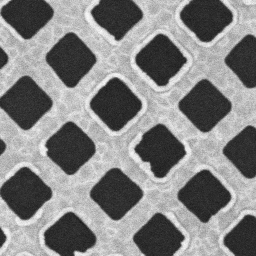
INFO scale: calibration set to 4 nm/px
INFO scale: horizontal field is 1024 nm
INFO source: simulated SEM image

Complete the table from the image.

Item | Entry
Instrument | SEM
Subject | a regular array of holes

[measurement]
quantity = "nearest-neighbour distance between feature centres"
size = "253 nm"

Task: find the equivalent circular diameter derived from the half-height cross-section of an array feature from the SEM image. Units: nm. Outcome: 187